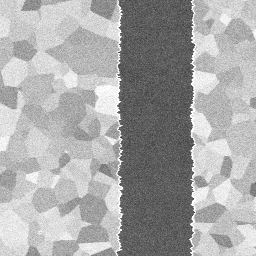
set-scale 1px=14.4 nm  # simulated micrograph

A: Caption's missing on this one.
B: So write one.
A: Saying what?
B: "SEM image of one or a few lines or trenches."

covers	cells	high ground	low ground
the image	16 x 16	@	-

@@@@@@@-----@@@@
@@@@@@@-----@@@@
@@@@@@@-----@@@@
@@@@@@@-----@@@@
@@@@@@@-----@@@@
@@@@@@@-----@@@@
@@@@@@@-----@@@@
@@@@@@@-----@@@@
@@@@@@@@----@@@@
@@@@@@@@----@@@@
@@@@@@@-----@@@@
@@@@@@@@----@@@@
@@@@@@@@----@@@@
@@@@@@@@----@@@@
@@@@@@@-----@@@@
@@@@@@@-----@@@@